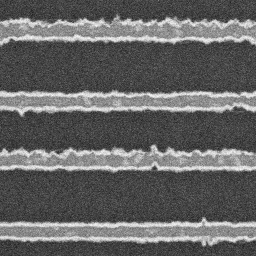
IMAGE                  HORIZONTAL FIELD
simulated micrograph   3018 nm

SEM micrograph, one or a few lines or trenches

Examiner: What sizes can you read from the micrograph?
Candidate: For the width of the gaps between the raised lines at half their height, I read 660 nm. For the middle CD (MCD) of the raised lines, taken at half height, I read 170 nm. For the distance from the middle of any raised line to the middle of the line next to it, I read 789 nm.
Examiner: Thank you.